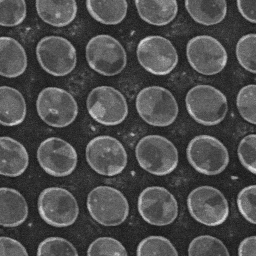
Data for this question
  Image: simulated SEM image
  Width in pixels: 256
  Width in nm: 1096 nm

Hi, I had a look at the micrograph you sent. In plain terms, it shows a regular array of raised bodies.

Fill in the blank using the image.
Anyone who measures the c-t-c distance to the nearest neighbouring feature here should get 0.212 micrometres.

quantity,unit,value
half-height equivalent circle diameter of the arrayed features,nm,166